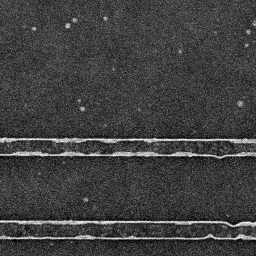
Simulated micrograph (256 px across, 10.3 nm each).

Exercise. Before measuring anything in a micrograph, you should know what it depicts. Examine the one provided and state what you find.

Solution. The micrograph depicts one or a few lines or trenches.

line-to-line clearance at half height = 66.1 px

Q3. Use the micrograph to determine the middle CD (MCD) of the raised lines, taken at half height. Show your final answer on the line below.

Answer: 16.6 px